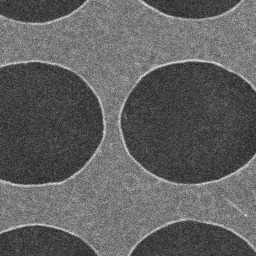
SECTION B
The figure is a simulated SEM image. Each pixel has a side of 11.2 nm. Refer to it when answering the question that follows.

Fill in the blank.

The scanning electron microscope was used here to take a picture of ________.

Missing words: holes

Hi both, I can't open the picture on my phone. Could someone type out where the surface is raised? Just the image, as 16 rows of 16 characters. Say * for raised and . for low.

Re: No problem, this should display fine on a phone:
.....*****.....*
****************
****************
****************
....*****.....**
......**........
......**........
......**........
......**........
......**........
.....****......*
*..*************
****************
****************
....******.....*
......**........